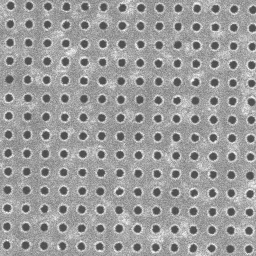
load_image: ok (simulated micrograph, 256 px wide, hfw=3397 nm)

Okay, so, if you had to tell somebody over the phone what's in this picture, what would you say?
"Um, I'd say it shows a regular array of holes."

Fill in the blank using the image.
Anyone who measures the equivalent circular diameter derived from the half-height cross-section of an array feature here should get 0.111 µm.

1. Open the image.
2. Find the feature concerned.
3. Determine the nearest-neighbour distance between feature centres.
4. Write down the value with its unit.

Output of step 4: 18 pixels